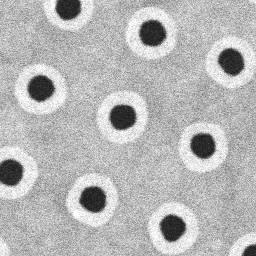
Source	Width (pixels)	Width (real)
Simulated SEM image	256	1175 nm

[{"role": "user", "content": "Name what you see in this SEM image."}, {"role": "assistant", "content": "ring-shaped raised bodies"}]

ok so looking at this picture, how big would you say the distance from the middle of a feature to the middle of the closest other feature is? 396 nanometres